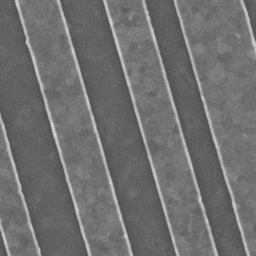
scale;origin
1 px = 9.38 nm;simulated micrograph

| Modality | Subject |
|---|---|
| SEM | one or a few lines or trenches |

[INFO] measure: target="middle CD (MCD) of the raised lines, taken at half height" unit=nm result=375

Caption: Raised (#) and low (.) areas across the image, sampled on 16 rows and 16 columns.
.###...##..####.
.###...##..#####
..##...###..####
..###...##..####
..###...##..####
...##...###.####
...###..###..###
...###...##..###
...###...##..###
#...##...###..##
#...###...##..##
#...###...##..##
#....##...###..#
##...###..###..#
##...###...##..#
##...###...##..#